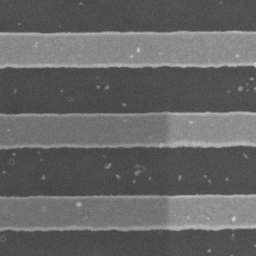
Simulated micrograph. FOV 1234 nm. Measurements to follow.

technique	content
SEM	lines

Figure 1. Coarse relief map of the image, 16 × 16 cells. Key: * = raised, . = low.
................
................
****************
****************
................
................
................
****************
****************
................
................
................
****************
****************
................
................